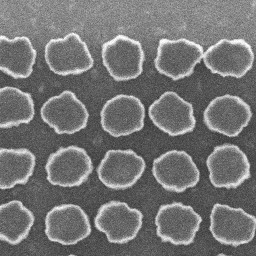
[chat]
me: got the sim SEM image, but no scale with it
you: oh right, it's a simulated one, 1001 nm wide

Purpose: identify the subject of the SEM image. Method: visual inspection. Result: a regular array of raised bodies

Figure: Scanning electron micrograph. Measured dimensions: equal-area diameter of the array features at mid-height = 0.167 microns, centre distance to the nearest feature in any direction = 203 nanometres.